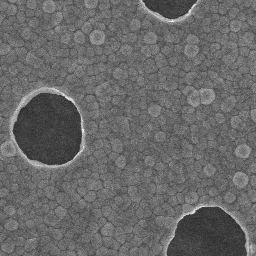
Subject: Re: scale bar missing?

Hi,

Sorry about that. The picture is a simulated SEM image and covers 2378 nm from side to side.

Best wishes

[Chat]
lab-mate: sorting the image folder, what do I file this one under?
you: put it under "holes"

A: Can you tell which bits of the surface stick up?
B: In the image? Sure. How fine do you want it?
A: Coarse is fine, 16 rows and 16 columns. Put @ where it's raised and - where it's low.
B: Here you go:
@@@@@@@@@---@@@@
@@@@@@@@@@@@@@@@
@@@@@@@@@@@@@@@@
@@@@@@@@@@@@@@@@
@@@@@@@@@@@@@@@@
@@@@@@@@@@@@@@@@
@----@@@@@@@@@@@
@----@@@@@@@@@@@
@----@@@@@@@@@@@
@----@@@@@@@@@@@
@@@@@@@@@@@@@@@@
@@@@@@@@@@@@@@@@
@@@@@@@@@@@@@@@@
@@@@@@@@@@@@--@@
@@@@@@@@@@@----@
@@@@@@@@@@@----@